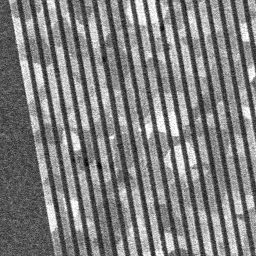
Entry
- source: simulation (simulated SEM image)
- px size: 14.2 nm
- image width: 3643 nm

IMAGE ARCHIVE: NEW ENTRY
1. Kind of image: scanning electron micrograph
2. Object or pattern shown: parallel lines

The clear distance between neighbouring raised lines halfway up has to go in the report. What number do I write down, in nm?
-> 87.6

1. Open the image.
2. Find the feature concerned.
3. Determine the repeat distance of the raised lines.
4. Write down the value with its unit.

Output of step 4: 0.176 microns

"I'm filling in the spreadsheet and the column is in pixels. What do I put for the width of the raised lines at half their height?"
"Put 6.03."